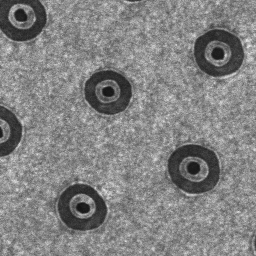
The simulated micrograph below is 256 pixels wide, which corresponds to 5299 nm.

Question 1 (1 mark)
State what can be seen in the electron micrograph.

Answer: ring-shaped grooves with a dot in the middle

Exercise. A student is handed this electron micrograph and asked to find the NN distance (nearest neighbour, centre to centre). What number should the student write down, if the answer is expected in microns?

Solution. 2.41